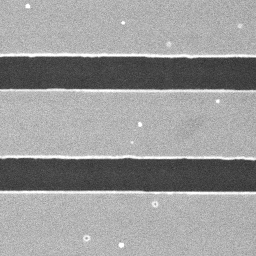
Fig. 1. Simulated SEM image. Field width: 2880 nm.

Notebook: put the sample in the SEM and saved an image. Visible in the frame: lines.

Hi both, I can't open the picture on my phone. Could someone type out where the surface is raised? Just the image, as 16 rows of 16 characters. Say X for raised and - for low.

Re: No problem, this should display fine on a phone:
XXXXXXXXXXXXXXXX
XXXXXXXXXXXXXXXX
XXXXXXXXXXXXXXXX
XX---XX--XXXXXXX
----------------
----------------
XXXXXXXXXXXXXXXX
XXXXXXXXXXXXXXXX
XXXXXXXXXXXXXXXX
XXXXXXXXXXXXXXXX
----------------
----------------
XXXXXXXXXXXXXXXX
XXXXXXXXXXXXXXXX
XXXXXXXXXXXXXXXX
XXXXXXXXXXXXXXXX